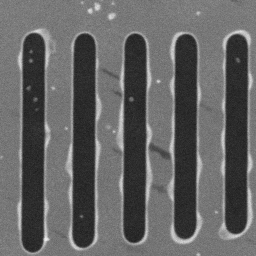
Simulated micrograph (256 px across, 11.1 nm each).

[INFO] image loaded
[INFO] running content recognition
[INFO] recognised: groups of lines, slits or small figures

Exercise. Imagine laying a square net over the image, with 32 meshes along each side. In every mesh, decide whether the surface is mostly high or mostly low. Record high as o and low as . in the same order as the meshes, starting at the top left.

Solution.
oooooooooooooooooooooooooooooooo
oooooooooooooooooooooooooooooooo
oooooooooooooooooooooooooooooooo
oooooooooooooooooooooooooooooooo
ooo...oooo.ooooo..oooo..ooooo..o
ooo...ooo...oooo..oooo...ooo...o
ooo...ooo...ooo...oooo...ooo...o
oo....ooo...ooo...oooo...ooo...o
ooo...ooo...ooo...oooo...ooo...o
ooo...ooo...ooo....ooo...ooo...o
ooo...ooo...ooo....ooo...ooo...o
ooo...ooo...ooo...oooo...ooo...o
ooo...ooo...ooo...oooo...ooo...o
ooo...ooo...ooo...oooo...ooo...o
ooo...ooo...ooo...oooo...ooo...o
ooo...ooo...ooo...oooo...ooo...o
ooo...ooo...ooo....ooo...ooo...o
ooo...ooo...ooo....ooo...ooo...o
ooo...ooo...ooo...oooo...ooo...o
ooo...ooo...ooo...oooo...ooo...o
ooo...ooo...ooo...oooo...ooo...o
ooo...ooo...ooo....ooo...ooo...o
ooo...ooo...ooo....ooo...ooo...o
ooo...ooo...ooo...oooo...ooo...o
ooo...ooo...ooo...oooo...ooo...o
ooo...ooo...ooo...oooo...ooo...o
oo....ooo...ooo...oooo...ooo...o
oo....ooo...ooo...oooo...ooo...o
ooo...ooo...ooo...oooo...ooo...o
ooo...ooo...oooo..oooo..oooooooo
ooo..oooo..ooooooooooooooooooooo
oooo.ooooooooooooooooooooooooooo